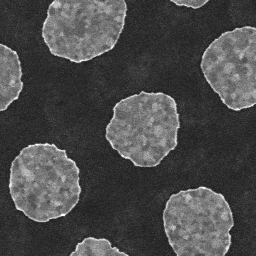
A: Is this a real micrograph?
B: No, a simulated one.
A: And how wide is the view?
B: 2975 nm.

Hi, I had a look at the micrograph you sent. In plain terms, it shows raised bodies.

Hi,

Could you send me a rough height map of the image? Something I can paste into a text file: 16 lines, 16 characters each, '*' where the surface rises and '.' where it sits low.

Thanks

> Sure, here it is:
...*****........
...*****........
...****.......**
*...**.......***
*............***
*............***
*......****...**
.......****.....
.......****.....
.***...****.....
.****...........
.****...........
.****......***..
..**......****..
..........****..
.....**....***..